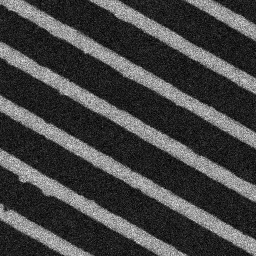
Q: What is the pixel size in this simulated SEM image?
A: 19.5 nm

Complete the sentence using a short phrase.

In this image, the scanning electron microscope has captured parallel lines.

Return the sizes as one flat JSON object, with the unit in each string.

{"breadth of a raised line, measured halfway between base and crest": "669 nm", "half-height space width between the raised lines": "241 nm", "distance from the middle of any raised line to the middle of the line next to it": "913 nm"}